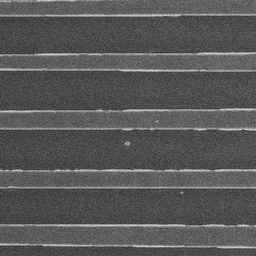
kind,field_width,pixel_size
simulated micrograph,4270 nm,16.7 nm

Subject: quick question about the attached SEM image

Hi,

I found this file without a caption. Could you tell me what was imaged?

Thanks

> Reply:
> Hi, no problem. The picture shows lines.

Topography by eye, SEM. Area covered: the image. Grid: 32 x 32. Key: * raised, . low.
********************************
********************************
................................
................................
................................
................................
................................
********************************
********************************
................................
................................
................................
................................
................................
********************************
********************************
................................
................................
................................
................................
................................
********************************
********************************
................................
................................
................................
................................
................................
********************************
********************************
********************************
................................